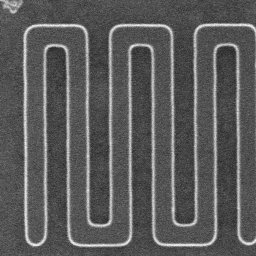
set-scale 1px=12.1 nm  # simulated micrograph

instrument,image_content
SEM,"groups of lines, slits or small figures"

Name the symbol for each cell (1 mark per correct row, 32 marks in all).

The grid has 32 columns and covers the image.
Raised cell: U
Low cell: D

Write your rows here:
DDDDDDDDDDDDDDDDDDDDDDDDDDDDDDDD
DDDDDDDDDDDDDDDDDDDDDDDDDDDDDDDD
DDDDDDDDDDDDDDDDDDDDDDDDDDDDDDDD
DDDDUUUUUUDDDDUUUUUUUDDDDUUUUUUU
DDDUUUUUUUUDDDUUUUUUUDDDUUUUUUUU
DDDUUUUUUUUDDDUUUUUUUDDDUUUUUUUU
DDDUUUDDUUUDDDUUDDDUUDDDUUUDDDUU
DDDUUUDDUUUDDDUUDDDUUDDDUUUDDDUU
DDDUUUDDUUUDDDUUDDDUUDDDUUUDDDUU
DDDUUUDDUUUDDDUUDDDUUDDDUUUDDDUU
DDDUUUDDUUUDDDUUDDDUUDDDUUUDDDUU
DDDUUUDDUUUDDDUUDDDUUDDDUUUDDDUU
DDDUUUDDUUUDDDUUDDDUUUDDUUUDDDUU
DDDUUUDDUUUDDDUUDDDUUUDDUUUDDDUU
DDDUUUDDUUUDDDUUDDDUUUDDUUUDDDUU
DDDUUUDDUUUDDDUUDDDUUUDDUUUDDDUU
DDDUUUDDDUUDDDUUDDDUUUDDUUUDDDUU
DDDUUUDDDUUDDDUUDDDUUUDDUUUDDDUU
DDDUUUDDDUUDDDUUDDDUUUDDUUUDDDUU
DDDUUUDDUUUDDDUUDDDUUUDDUUUDDDUU
DDDUUUDDDUUDDDUUDDDUUUDDUUUDDDUU
DDDUUUDDDUUDDDUUDDDUUUDDUUUDDDUU
DDDUUUDDDUUDDDUUDDDUUUDDDUUDDDUU
DDDUUUDDDUUDDDUUDDDUUUDDDUUDDDUU
DDDUUUDDDUUDDDUUDDDUUUDDDUUDDDUU
DDDUUUDDDUUDDDUUDDDUUUDDDUUDDDUU
DDDUUUDDDUUDDDUUDDDUUUDDDUUDDDUU
DDDUUUDDDUUDDDUUDDDUUUDDUUUDDDUU
DDDUUUDDDUUUUUUUDDDUUUUUUUUDDDUU
DDDUUUDDDUUUUUUUDDDUUUUUUUUDDDUU
DDDDUDDDDUUUUUUUDDDDUUUUUUDDDDDD
DDDDDDDDDDDDDDDDDDDDDDDDDDDDDDDD